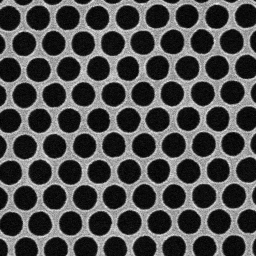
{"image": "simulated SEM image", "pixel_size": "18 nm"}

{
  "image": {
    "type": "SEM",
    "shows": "a regular array of holes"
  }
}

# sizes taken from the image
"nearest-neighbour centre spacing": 527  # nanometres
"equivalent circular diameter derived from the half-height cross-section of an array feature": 442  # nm